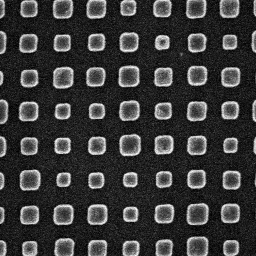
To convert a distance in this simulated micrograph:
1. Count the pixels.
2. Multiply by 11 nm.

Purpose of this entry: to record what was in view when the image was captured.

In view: a regular array of raised bodies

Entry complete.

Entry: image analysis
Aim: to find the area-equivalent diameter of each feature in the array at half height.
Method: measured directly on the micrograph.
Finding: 203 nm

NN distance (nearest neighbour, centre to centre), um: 0.364